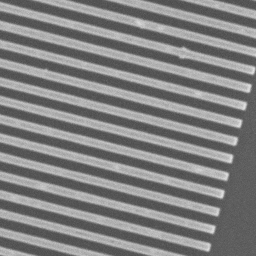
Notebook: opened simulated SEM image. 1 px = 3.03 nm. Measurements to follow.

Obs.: parallel lines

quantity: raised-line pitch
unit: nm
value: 55.2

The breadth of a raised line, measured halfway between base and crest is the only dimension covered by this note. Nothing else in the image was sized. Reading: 22.8 nanometres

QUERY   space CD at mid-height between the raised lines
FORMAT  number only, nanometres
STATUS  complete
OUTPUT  33